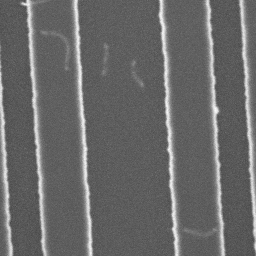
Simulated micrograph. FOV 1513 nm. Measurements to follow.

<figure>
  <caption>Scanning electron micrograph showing lines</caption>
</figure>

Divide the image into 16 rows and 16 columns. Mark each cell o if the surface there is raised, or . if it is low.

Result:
..ooo.....ooo..o
..ooo.....ooo..o
..ooo.....ooo..o
..ooo.....ooo..o
..ooo.....ooo..o
..ooo.....ooo..o
..ooo.....ooo..o
..ooo.....oooo.o
..ooo......ooo..
..ooo......ooo..
..ooo......ooo..
..ooo......ooo..
o.oooo.....ooo..
o..ooo.....ooo..
o..ooo.....ooo..
o..ooo.....ooo..